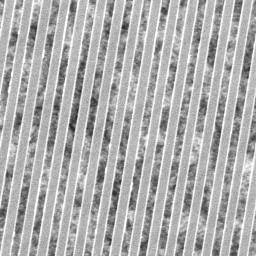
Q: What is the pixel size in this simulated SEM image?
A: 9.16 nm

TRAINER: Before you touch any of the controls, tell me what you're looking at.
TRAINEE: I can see parallel lines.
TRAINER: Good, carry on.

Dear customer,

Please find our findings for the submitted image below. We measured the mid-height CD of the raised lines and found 88.1 nm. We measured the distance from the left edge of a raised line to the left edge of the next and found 165 nanometers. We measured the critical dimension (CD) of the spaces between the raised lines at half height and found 0.078 microns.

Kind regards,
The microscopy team